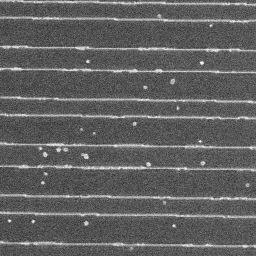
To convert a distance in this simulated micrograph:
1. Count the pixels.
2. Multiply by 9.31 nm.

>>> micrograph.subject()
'lines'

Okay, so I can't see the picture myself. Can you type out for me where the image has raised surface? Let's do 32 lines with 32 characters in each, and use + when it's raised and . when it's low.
+++++++++++++++++++++++++++++++.
++++++++++++++++++++++++++++++++
....................++++++++++++
................................
................................
................................
++++++++++++++++++++++++++++++++
++++++++++++++++++++++++++++++++
++++++++++++++++++++++++++++++++
................................
................................
................................
+++++++++++++++++++.............
++++++++++++++++++++++++++++++++
..........++++++++++++++++++++++
................................
................................
................................
++++++++++++++++++++++++++++++++
++++++++++++++++++++++++++++++++
++++++++++++++++++++++++++++++++
................................
................................
................................
++++............................
++++++++++++++++++++++++++++++++
++++++++++++++++++++++++++++++++
................................
................................
................................
+++++...........................
++++++++++++++++++++++++++++++++